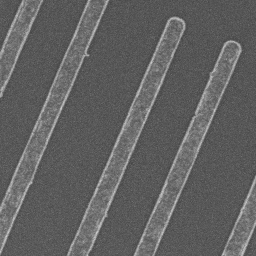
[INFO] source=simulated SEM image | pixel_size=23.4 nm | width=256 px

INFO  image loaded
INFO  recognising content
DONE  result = one or a few lines or trenches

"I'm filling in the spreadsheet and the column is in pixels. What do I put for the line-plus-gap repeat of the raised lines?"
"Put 69.1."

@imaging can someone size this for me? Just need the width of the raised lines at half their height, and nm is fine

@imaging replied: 397